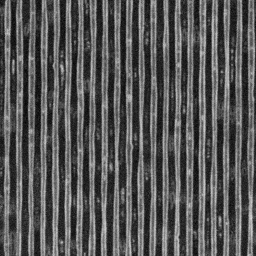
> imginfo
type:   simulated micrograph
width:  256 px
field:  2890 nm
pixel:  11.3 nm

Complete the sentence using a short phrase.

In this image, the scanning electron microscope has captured parallel lines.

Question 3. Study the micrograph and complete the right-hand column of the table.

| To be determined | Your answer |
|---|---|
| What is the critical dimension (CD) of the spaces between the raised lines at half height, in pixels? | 7.75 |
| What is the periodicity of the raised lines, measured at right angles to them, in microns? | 0.138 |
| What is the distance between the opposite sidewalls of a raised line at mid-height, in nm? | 55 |